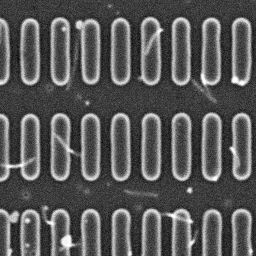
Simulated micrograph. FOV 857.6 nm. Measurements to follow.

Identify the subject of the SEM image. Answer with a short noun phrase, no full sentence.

groups of lines, slits or small figures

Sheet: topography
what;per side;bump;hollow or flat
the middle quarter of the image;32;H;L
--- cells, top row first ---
HLLLLHHHHLLLHHHHLLLHHHHHLLLHHHHL
HLLLLHHHHLLLHHHHLLLLHHHHLLLHHHHL
HLLLLHHHHLLLHHHHLLLLHHHHLLLHHHHL
HLLLLHHHHLLLHHHHLLLLHHHHLLLHHHHL
HLLLLHHHLLLLLHHHLLLLHHHLLLLLHHHL
LLLLLLLLLLLLLLLLLLLLLLLLLLLLLLLL
LLLLLLLLLLLLLLLLLLLLLLLLLLLLLLLL
LLLLLLLLLLLLLLLLLLLLLLLLLLLLLLLL
LLLLLLLLLLLLLLLLLLLLLLLLLLLLLLLL
LLLLLLLLLLLLLLLLLLLLLLLLLLLLLLLL
LLLLLLLLLLLLLLLLLLLLLLLLLLLLLLLL
LLLLLLLLLLLLLLLLLLLLLLLLLLLLLLLL
LLLLLLLLLLLLLLLLLLLLLLLLLLLLLLLL
HLLLLHHHLLLLHHHHLLLLHHHHLLLHHHHL
HLLLLHHHHLLLHHHHLLLLHHHHLLLHHHHH
HLLLLHHHHLLLHHHHLLLLHHHHLLLHHHHH
HLLLLHHHHLLLHHHHLLLLHHHHLLLHHHHH
HLLLLHHHHLLLHHHHLLLLHHHHLLLHHHHH
HLLLLHHHHLLLHHHHLLLLHHHHLLLHHHHH
HLLLLHHHHLLLHHHHLLLLHHHHLLLHHHHH
HLLLLHHHHLLLHHHHLLLLHHHHLLLHHHHH
HHLLLHHHHLLLHHHHLLLLHHHHLLLHHHHH
HLLLLHHHHLLLHHHHLLLLHHHHLLLHHHHH
HLLLLHHHHLLLHHHHLLLLHHHHLLLHHHHH
HLLLLHHHHLLLHHHHLLLLHHHHLLLHHHHH
HLLLLHHHHLLLHHHHLLLLHHHHLLLHHHHH
HLLLLHHHHLLLHHHHLLLLHHHHLLLHHHHH
HLLLLHHHHLLLHHHHLLLLHHHHLLLHHHHL
LLLLLHHHLLLLLHHHLLLLHHHLLLLLHHHL
LLLLLLLLLLLLLLLLLLLLLLLLLLLLLLLL
LLLLLLLLLLLLLLLLLLLLLLLLLLLLLLLL
LLLLLLLLLLLLLLLLLLLLLLLLLLLLLLLH